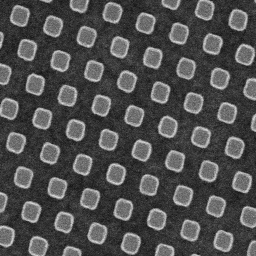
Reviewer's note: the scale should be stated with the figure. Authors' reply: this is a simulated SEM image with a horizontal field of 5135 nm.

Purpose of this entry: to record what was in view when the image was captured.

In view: a regular array of raised bodies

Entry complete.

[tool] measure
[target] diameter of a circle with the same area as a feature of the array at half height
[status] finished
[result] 391 nanometers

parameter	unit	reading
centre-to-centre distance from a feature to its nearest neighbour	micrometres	0.696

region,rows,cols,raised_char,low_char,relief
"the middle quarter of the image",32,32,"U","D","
UDDDDDUUUUDDDDDDDDDDDUUUDDDDDUUU
DDDDDUUUUUDDDDDDDDDDDDDDDDDDUUUU
DDDDDUUUUUDDDDUUUDDDDDDDDDDDUUUU
DDDDDDUUUDDDDDUUUUDDDDDDDDDDDDUU
DDDDDDDDDDDDDDUUUUDDDDDDDDDDDDDD
UDDDDDDDDDDDDDUUUUDDDDUUUUDDDDDD
UUUDDDDDDDDDDDDUUDDDDDUUUUDDDDDD
UUUDDDDDDDDDDDDDDDDDDDUUUUDDDDDU
UUUDDDDDUUUDDDDDDDDDDDUUUUDDDDDU
UUUDDDDUUUUUDDDDDDDDDDDDUDDDDDUU
DDDDDDDUUUUDDDDDDDDDDDDDDDDDDDUU
DDDDDDDUUUUDDDDDUUUUDDDDDDDDDDDU
DDDDDDDDUUUDDDDDUUUUDDDDDDDDDDDD
DDDDDDDDDDDDDDDUUUUUDDDDDUUDDDDD
DUUUDDDDDDDDDDDDUUUDDDDDUUUUDDDD
DUUUUDDDDDDDDDDDDDDDDDDDUUUUDDDD
DUUUUDDDDDUDDDDDDDDDDDDDUUUUDDDD
DUUUUDDDDUUUUDDDDDDDDDDDUUUUDDDD
DUUUDDDDDUUUUDDDDDDDDDDDDDDDDDDD
DDDDDDDDDUUUUDDDDDUUDDDDDDDDDDDD
DDDDDDDDDUUUUDDDDDUUUUDDDDDDDDDD
DDDDDDDDDDDDDDDDDUUUUUDDDDDDDDDD
DDDDDDDDDDDDDDDDDUUUUDDDDDUUUDDD
DDDUUUUDDDDDDDDDDDUUUDDDDDUUUUDD
DDDUUUUDDDDDDDDDDDDDDDDDDDUUUUDD
DDUUUUUDDDDDUUDDDDDDDDDDDDUUUUDD
DDDUUUDDDDDUUUUDDDDDDDDDDDDUUDDD
DDDDUUDDDDDUUUUDDDDDDDDDDDDDDDDD
DDDDDDDDDDDUUUUDDDDDUUUDDDDDDDDD
DDDDDDDDDDDDUUUDDDDUUUUUDDDDDDDD
UDDDDDDDDDDDDDDDDDDUUUUDDDDDDDDD
DDDDDUUDDDDDDDDDDDDUUUUDDDDDUUUU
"